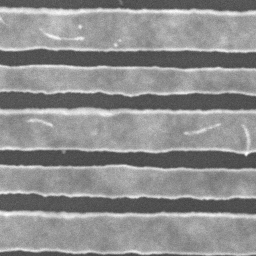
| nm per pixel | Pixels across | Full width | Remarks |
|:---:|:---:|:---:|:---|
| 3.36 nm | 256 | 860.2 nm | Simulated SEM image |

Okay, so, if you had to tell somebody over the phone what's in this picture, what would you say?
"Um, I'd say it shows lines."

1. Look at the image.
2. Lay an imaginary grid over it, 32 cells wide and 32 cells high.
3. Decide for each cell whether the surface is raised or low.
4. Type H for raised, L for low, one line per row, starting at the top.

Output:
LLLLLLLLLLLLLLLLLLLLLLLLLLLLLLLL
HHHHHHHHHHHHHHHHHHHHHHHHHHHHHLLH
HHHHHHHHHHHHHHHHHHHHHHHHHHHHHHHH
HHHHHHHHHHHHHHHHHHHHHHHHHHHHHHHH
HHHHHHHHHHHHHHHHHHHHHHHHHHHHHHHH
HHHHHHHHHHHHHHHHHHHHHHHHHHHHHHHH
LLLLLLLLLLLLLLLLLLLLLLLLLLLLHHHL
LLLLLLLLLLLLLLLLLLLLLLLLLLLLLLLL
HHHHHHHHHHHHHHHHHHHHLLLLLLLLLLLL
HHHHHHHHHHHHHHHHHHHHHHHHHHHHHHHH
HHHHHHHHHHHHHHHHHHHHHHHHHHHHHHHH
LLLLHHHHLLHHHHHHHHHHHHHHHHHHHHHH
LLLLLLLLLLLLLLLLLLLLLLLLLLLLLLLL
LLLLLLLLLLLLLLLLLLLLLLLLLLLLLLLL
HHHHHHHHHHHHHHHHHHHHHHHHHHHHHHHH
HHHHHHHHHHHHHHHHHHHHHHHHHHHHHHHH
HHHHHHHHHHHHHHHHHHHHHHHHHHHHHHHH
HHHHHHHHHHHHHHHHHHHHHHHHHHHHHHHH
HHHHHHHHHHHHHHHHHHHHHHHHHHHHHHHH
LLLLLLLLLLLLLLLLLLLLLLLLLLLLLLLL
LLLLLLLLLLLLLLLLLLLLLLLLLLLLLLLL
HHHHHHHHHHHHHHHHHHHHHHHHHHHHHHHH
HHHHHHHHHHHHHHHHHHHHHHHHHHHHHHHH
HHHHHHHHHHHHHHHHHHHHHHHHHHHHHHHH
LLLLLHLLHHHHHHHHHHHHHHHHHHHHHHHH
LLLLLLLLLLLLLLLLLLLLLLLLLLLLLLLL
LLLLLLLLLLLLLLLLLLLLLLLLLLLLLLLL
HHHHHHHHHHHHHHHHHHHHHHHHHHHHHHHH
HHHHHHHHHHHHHHHHHHHHHHHHHHHHHHHH
HHHHHHHHHHHHHHHHHHHHHHHHHHHHHHHH
HHHHHHHHHHHHHHHHHHHHHHHHHHHHHHHH
LLLLLLLLHHHHHHHHHHHHHHHHHHHHHHHH